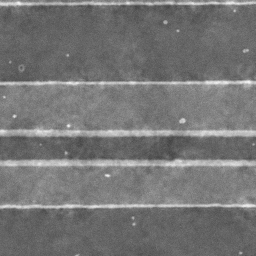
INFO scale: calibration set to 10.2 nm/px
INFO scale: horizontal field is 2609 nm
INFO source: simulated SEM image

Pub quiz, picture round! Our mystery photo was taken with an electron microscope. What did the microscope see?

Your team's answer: lines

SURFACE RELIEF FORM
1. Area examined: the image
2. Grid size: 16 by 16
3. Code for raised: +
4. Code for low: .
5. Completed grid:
................
................
................
................
................
++++++++++++++++
++++++++++++++++
++++++++++++++++
.....+..........
................
++++++++++++++++
++++++++++++++++
++++++++++++++++
................
................
................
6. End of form